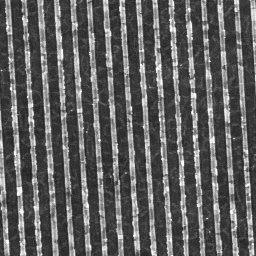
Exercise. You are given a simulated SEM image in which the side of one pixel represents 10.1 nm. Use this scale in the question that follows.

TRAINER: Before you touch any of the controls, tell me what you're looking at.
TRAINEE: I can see parallel lines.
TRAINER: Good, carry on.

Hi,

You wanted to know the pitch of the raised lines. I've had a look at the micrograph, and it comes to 0.165 microns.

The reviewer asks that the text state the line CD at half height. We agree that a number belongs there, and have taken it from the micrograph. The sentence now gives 39.2 nanometers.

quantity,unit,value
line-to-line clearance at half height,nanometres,126